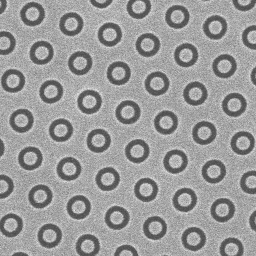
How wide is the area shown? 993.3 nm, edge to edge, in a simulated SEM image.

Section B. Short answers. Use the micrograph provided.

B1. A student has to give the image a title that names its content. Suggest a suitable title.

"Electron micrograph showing a regular array of ring-shaped grooves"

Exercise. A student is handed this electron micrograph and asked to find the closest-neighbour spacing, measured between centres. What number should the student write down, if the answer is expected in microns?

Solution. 0.152